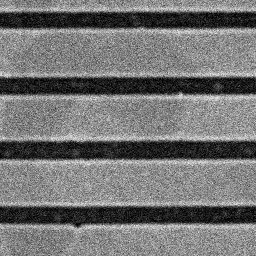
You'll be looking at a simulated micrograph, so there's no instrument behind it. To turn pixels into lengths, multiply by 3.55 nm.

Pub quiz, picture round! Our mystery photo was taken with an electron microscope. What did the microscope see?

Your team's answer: one or a few lines or trenches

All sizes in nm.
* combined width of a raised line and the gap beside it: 231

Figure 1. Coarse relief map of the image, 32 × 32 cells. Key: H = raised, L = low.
HHHHHHHHHHHHHHHHHHHHHHHHHHHHHHHH
LLLLLLLLLLLLLLLLLLLLLLLLLLLLLLLL
LLLLLLLLLLLLLLLLLLLLLLLLLLLLLLLL
LLLLLLLLLLLLLLLLLLLLLLLLLLLLLLLL
HHHHHHHHHHHHHHHHHHHHHHHHHHHHHHHH
HHHHHHHHHHHHHHHHHHHHHHHHHHHHHHHH
HHHHHHHHHHHHHHHHHHHHHHHHHHHHHHHH
HHHHHHHHHHHHHHHHHHHHHHHHHHHHHHHH
HHHHHHHHHHHHHHHHHHHHHHHHHHHHHHHH
LLLLHHLLLLLLLLLLLLLLLLLLLLLLLLLL
LLLLLLLLLLLLLLLLLLLLLLLLLLLLLLLL
LLLLLLLLLLLLLLLLLLLLLLLLLLLLLLLL
HHHHHHHHHHHHHHHHHHHHHHHHHHHHHHHH
HHHHHHHHHHHHHHHHHHHHHHHHHHHHHHHH
HHHHHHHHHHHHHHHHHHHHHHHHHHHHHHHH
HHHHHHHHHHHHHHHHHHHHHHHHHHHHHHHH
HHHHHHHHHHHHHHHHHHHHHHHHHHHHHHHH
LLLLLLLLLLLLLLLLLLLLLLLLLLLLLLLL
LLLLLLLLLLLLLLLLLLLLLLLLLLLLLLLL
LLLLLLLLLLLLLLLLLLLLLLLLLLLLLLLL
HHHHHHHHHHHHHHHHHHHHHHHHHHHHHHHH
HHHHHHHHHHHHHHHHHHHHHHHHHHHHHHHH
HHHHHHHHHHHHHHHHHHHHHHHHHHHHHHHH
HHHHHHHHHHHHHHHHHHHHHHHHHHHHHHHH
HHHHHHHHHHHHHHHHHHHHHHHHHHHHHHHH
HHHHHHHHHHHHHHHHHHHHHHHHHHHHHHHH
LLLLLLLLLLLLLLLLLLLLLLLLLLLLLLLL
LLLLLLLLLLLLLLLLLLLLLLLLLLLLLLLL
HHHHHHHHHHHHHHHHHHHHHHHHHHHHHHHH
HHHHHHHHHHHHHHHHHHHHHHHHHHHHHHHH
HHHHHHHHHHHHHHHHHHHHHHHHHHHHHHHH
HHHHHHHHHHHHHHHHHHHHHHHHHHHHHHHH